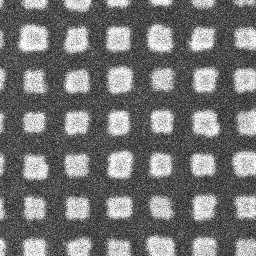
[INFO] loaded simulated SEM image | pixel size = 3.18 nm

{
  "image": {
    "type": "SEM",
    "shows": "a regular array of raised bodies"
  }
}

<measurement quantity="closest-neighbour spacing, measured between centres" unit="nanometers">131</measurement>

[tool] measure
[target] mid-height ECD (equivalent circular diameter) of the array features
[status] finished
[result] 22.8 pixels